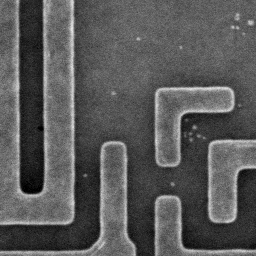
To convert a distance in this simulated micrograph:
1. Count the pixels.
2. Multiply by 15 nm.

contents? wiring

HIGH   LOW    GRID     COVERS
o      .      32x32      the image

oo...oooo.......................
oo...oooo.......................
oo...oooo.......................
oo...oooo.......................
oo...oooo.......................
oo...oooo.......................
oo...oooo.......................
oo...oooo.......................
oo...oooo.......................
oo...oooo.......................
oo...oooo.......................
oo...oooo...........ooooooooo...
oo...oooo...........ooooooooo...
oo...oooo...........ooooooooo...
oo...oooo...........ooo.........
oo....ooo...........ooo.........
oo....ooo...........ooo.........
oo....ooo...........ooo.........
oo....ooo....ooo....ooo...oooooo
oo....ooo....ooo....ooo...oooooo
oo....ooo....ooo....oo....oooooo
oo....ooo....ooo..........oooo..
oo....ooo....ooo..........oooo..
oo...oooo....ooo..........oooo..
ooooooooo....ooo..........oooo..
ooooooooo....ooo....ooo...oooo..
ooooooooo....ooo....ooo...oooo..
ooooooooo....ooo...oooo...ooo...
.............ooo...oooo.........
............oooo...oooo.........
............ooooo..oooo.........
ooooooooooooooooo...oooooooooooo